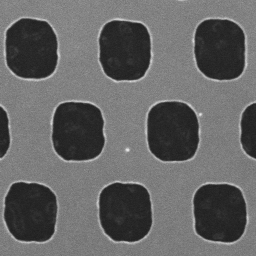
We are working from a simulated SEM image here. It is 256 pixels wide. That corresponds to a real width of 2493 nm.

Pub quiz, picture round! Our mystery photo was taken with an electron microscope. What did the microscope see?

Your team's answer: a regular array of holes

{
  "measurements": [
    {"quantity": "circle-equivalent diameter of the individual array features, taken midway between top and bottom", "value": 572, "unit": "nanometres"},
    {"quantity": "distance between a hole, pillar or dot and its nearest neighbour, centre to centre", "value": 909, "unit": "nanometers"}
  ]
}